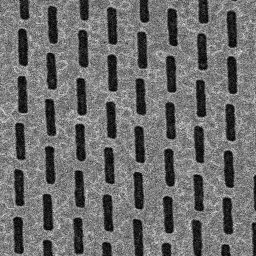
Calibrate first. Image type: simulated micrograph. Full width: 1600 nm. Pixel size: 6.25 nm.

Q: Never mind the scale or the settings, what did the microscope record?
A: a regular array of holes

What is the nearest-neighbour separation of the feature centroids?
0.234 micrometres